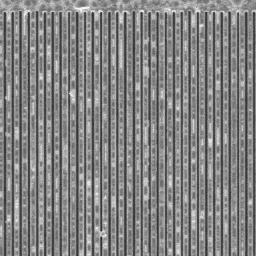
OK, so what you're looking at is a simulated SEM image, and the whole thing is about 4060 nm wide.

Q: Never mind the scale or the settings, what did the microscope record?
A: parallel lines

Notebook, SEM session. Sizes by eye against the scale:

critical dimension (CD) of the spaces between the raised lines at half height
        2.88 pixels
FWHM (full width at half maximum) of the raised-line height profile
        0.0773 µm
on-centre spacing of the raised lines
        128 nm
